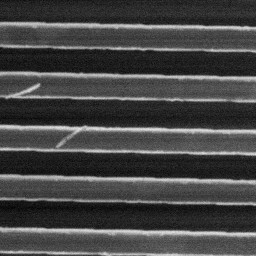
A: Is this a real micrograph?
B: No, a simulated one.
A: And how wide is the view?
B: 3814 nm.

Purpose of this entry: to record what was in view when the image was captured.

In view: lines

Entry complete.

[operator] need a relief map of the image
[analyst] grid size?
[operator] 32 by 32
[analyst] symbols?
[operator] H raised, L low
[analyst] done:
LLLLLLLLLLLLLLLLLLLLLLLLLLLLLLLL
LLLLLLLLLLLLLLLLLLLLLLLLLLLLLLLL
LLLLLLLLLLLLLLLLLLLLLLLLLLLLLLLL
HHHHHHHHHHHHHHHHHHHHHHHHHHHHHHHH
HHHHHHHHHHHHHHHHHHHHHHHHHHHHHHHH
HHHHHHHHHHHHHHHHHHHHHHHHHHHHHHHH
LLLLLLLLLLLLLLLLLLLLLLLLLLLLLLLL
LLLLLLLLLLLLLLLLLLLLLLLLLLLLLLLL
LLLLLLLLLLLLLLLLLLLLLLLLLLLLLLLL
HHHHHHHHHHHHHHHHHHHHLLLLLLLLLLLL
HHHHHHHHHHHHHHHHHHHHHHHHHHHHHHHH
HHHHHHHHHHHHHHHHHHHHHHHHHHHHHHHH
LLLLLLLLLLLLLLLLLLLLLHHHHHHHHHHH
LLLLLLLLLLLLLLLLLLLLLLLLLLLLLLLL
LLLLLLLLLLLLLLLLLLLLLLLLLLLLLLLL
LLLLLLLLLLLLLLLLLLLLLLLLLLLLLLLL
HHHHHHHHHHHHHHHHHHHHHHHHHHHHHHHH
HHHHHHHHHHHHHHHHHHHHHHHHHHHHHHHH
HHHHHHHHHHHHHHHHHHHHHHHHHHHHHHHH
LLLLLLLLLLLLLLLLLLLLLLLLLLLLLLLL
LLLLLLLLLLLLLLLLLLLLLLLLLLLLLLLL
LLLLLLLLLLLLLLLLLLLLLLLLLLLLLLLL
HHHHHHHHHHHHHHHHHHHHHHHHHHHHHLLL
HHHHHHHHHHHHHHHHHHHHHHHHHHHHHHHH
HHHHHHHHHHHHHHHHHHHHHHHHHHHHHHHH
LLLLLLLLLLLLLLLLLLLLLLLLLLLHHHHH
LLLLLLLLLLLLLLLLLLLLLLLLLLLLLLLL
LLLLLLLLLLLLLLLLLLLLLLLLLLLLLLLL
LLLLLLLLLLLLLLLLLLLLLLLLLLLLLLLL
HHHHHHHHHHHHHHHHHHHHHHHHHHHHHHHH
HHHHHHHHHHHHHHHHHHHHHHHHHHHHHHHH
HHHHHHHHHHHHHHHHHHHHHHHHHHHHHHHH